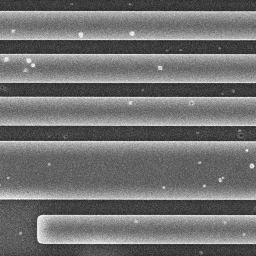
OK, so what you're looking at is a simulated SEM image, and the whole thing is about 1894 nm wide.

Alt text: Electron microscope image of groups of lines, slits or small figures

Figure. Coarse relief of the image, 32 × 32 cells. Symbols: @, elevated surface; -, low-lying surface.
--------------------------------
@@@-----------------------------
@@@@@@@@@@@@@@@@@@@@@@@@@@@@@@@@
@@@@@@@@@@@@@@@@@@@@@@@@@@@@@@@@
@@@@@@@@@@@@@@@@@@@@@@@@@@@@@@@@
--------------------------------
--------------------------------
@@@@@@@@@@@@@@@@@@@@@@@@@@@@@@@@
@@@@@@@@@@@@@@@@@@@@@@@@@@@@@@@@
@@@@@@@@@@@@@@@@@@@@@@@@@@@@@@@@
--------------------------------
--------------------------------
@@@@@@@@@@@@@@@@@@@@@@@@@@@@@@@@
@@@@@@@@@@@@@@@@@@@@@@@@@@@@@@@@
@@@@@@@@@@@@@@@@@@@@@@@@@@@@@@@@
@@@@@@@@@@@@@@@@@@@@@@@@@@@@@@@@
--------------------------------
--------------------------------
@@@@@@@@@@@@@@@@@@@@@@@@@@@@@@@@
@@@@@@@@@@@@@@@@@@@@@@@@@@@@@@@@
@@@@@@@@@@@@@@@@@@@@@@@@@@@@@@@@
@@@@@@@@@@@@@@@@@@@@@@@@@@@@@@@@
@@@@@@@@@@@@@@@@@@@@@@@@@@@@@@@@
@@@@@@@@@@@@@@@@@@@@@@@@@@@@@@@@
@@@@@@@@@@@@@@@@@@@@@@@@@@@@@@@@
--------------------------------
--------------------------------
-----@@@@@@@@@@@@@@@@@@@@@@@@@@@
-----@@@@@@@@@@@@@@@@@@@@@@@@@@@
-----@@@@@@@@@@@@@@@@@@@@@@@@@@@
--------------------------------
--------------------------------